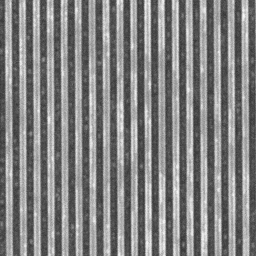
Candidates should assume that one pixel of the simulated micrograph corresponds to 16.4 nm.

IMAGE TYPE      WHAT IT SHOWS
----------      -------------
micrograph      parallel lines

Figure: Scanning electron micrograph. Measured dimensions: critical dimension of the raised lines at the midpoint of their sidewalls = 0.0922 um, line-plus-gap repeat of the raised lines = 228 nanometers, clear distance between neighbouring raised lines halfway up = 137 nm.